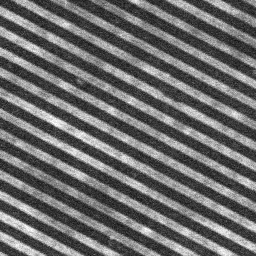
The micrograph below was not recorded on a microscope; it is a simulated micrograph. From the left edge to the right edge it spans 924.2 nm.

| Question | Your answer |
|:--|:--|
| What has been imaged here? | parallel lines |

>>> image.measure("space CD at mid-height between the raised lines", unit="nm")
39.8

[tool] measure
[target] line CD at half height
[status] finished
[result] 23.1 nm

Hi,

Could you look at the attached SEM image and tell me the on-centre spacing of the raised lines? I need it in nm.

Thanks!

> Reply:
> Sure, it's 65.3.